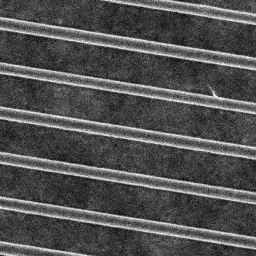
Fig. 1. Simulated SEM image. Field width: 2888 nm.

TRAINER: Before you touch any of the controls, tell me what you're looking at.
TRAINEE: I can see parallel lines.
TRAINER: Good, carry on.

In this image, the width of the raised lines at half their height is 130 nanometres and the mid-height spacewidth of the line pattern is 0.37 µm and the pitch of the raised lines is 499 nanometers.